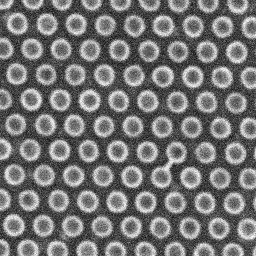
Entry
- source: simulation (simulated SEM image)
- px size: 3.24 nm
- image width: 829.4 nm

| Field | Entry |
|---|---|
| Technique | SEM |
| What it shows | a regular array of raised bodies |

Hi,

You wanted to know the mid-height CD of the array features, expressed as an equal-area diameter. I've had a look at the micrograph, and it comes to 61.6 nm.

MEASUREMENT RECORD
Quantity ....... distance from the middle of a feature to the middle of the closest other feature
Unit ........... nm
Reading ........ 93.6